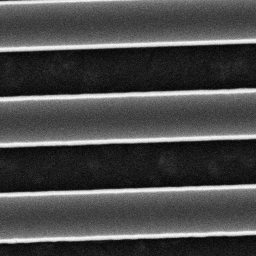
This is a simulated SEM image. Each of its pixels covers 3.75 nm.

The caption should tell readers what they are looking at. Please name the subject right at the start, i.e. one or a few lines or trenches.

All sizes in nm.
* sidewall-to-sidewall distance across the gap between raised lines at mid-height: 183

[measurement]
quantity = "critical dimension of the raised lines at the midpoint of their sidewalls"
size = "176 nm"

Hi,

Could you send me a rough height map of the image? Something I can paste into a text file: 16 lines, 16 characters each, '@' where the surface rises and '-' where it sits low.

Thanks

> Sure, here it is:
@@@@@@@@@@@@@@@@
@@@@@@@@@@@@@@@@
@@@@@@@@@@@@@@@@
----------------
----------------
----------------
@@@@@@@@@@@@@@@@
@@@@@@@@@@@@@@@@
@@@@@@@@@@@@@@@@
----------------
----------------
----------------
@@@@@@@@@@@@@@@@
@@@@@@@@@@@@@@@@
@@@@@@@@@@@@@@@@
----------------